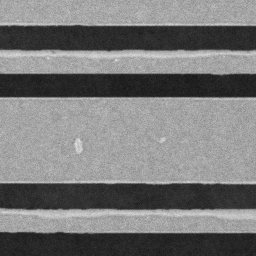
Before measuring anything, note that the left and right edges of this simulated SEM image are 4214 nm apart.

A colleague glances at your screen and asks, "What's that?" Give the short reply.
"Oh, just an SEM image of lines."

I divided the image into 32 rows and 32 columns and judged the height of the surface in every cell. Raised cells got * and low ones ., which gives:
********************************
********************************
********************************
................................
................................
................................
................................
********************************
********************************
................................
................................
................................
********************************
********************************
********************************
********************************
********************************
********************************
********************************
********************************
********************************
********************************
********************************
................................
................................
................................
****.........***................
********************************
********************************
................................
................................
................................